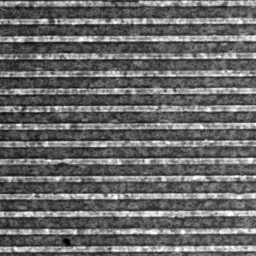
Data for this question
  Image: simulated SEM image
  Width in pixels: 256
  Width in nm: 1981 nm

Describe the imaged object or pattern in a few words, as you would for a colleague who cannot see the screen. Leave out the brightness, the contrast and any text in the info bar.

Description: parallel lines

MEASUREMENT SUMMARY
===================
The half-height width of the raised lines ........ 37.7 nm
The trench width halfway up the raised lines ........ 98.7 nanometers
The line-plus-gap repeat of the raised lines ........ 17.5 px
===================